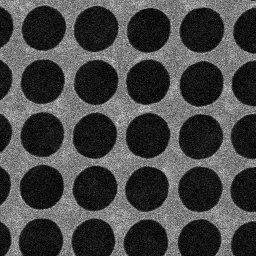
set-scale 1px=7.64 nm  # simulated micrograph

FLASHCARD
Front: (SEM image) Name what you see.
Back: a regular array of holes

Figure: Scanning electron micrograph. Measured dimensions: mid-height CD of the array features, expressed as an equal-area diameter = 341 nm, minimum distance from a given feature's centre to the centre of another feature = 0.4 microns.